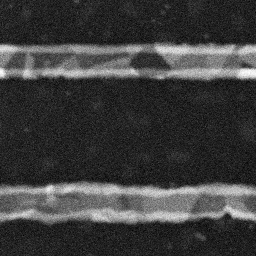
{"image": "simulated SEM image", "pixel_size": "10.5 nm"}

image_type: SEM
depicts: one or a few lines or trenches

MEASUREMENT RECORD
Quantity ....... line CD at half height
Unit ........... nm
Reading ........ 245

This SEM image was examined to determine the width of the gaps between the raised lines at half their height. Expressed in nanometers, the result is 1240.